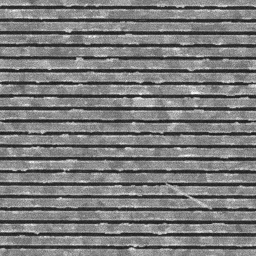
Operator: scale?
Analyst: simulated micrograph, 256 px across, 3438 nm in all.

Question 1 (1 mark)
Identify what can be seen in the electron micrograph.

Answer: parallel lines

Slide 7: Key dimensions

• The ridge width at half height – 118 nm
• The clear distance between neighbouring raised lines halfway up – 58.7 nm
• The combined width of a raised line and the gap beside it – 169 nm